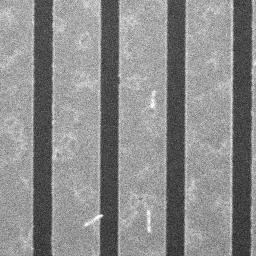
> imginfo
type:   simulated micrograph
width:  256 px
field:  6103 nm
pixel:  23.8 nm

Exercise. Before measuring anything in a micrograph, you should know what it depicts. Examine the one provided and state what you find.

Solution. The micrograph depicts one or a few lines or trenches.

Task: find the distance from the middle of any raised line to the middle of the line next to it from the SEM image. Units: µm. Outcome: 1.57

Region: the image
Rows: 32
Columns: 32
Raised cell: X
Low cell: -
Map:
XXXX---XXXXX---XXXXXX--XXXXXX---
XXXX---XXXXX---XXXXXX--XXXXXX---
XXXX---XXXXX---XXXXXX--XXXXXX---
XXXX---XXXXX---XXXXXX--XXXXXX---
XXXX---XXXXX---XXXXXX--XXXXXX---
XXXX---XXXXX---XXXXXX--XXXXXX---
XXXX---XXXXX---XXXXXX--XXXXXX---
XXXX---XXXXX---XXXXXX--XXXXXX---
XXXX---XXXXX---XXXXXX--XXXXXX---
XXXX---XXXXX---XXXXXX--XXXXXX---
XXXX---XXXXX---XXXXXX--XXXXXX---
XXXX---XXXXX---XXXXXX--XXXXXX---
XXXX---XXXXX---XXXXXX--XXXXXX---
XXXX---XXXXX---XXXXXX--XXXXXX---
XXXX---XXXXX---XXXXXX--XXXXXX---
XXXX---XXXXX---XXXXXX--XXXXXX---
XXXX---XXXXX---XXXXXX--XXXXXX---
XXXX---XXXXX---XXXXXX--XXXXXX---
XXXX---XXXXX---XXXXXX--XXXXXX---
XXXX----XXXX---XXXXXX--XXXXXX---
XXXX---XXXXX---XXXXXX--XXXXXX---
XXXX---XXXXX---XXXXXX--XXXXXX---
XXXX---XXXXX---XXXXXX--XXXXXX---
XXXX---XXXXX---XXXXXX--XXXXXX---
XXXX---XXXXX---XX-XXX--XXXXXX---
XXXX---XXXXX---XXXXXX--XXXXXX---
XXXX---XXXXX---XXXXXX--XXXXXX---
XXXX---XXXXX---XXXXXX--XXXXXX---
XXXX---XXXXX---XXXXXX--XXXXXX---
XXXX---XXXXX---XXXXXX--XXXXXX---
XXXX---XXXXX---XXXXXX--XXXXXX---
X-XX---XXXXX---XXXXXX--XXXXXX---